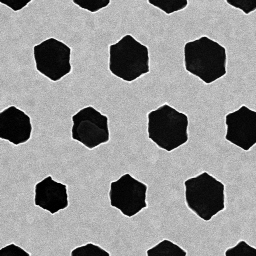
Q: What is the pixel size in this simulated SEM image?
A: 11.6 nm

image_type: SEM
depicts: a regular array of holes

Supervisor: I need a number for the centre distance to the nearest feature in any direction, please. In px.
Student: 76.6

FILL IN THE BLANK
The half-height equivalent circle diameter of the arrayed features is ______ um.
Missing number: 0.466